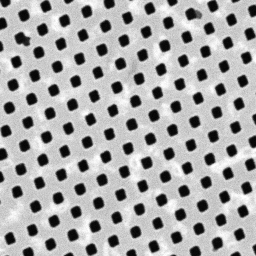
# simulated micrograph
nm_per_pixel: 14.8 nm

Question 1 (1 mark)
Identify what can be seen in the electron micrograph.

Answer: a regular array of holes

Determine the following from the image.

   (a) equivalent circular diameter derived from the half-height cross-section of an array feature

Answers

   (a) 180 nm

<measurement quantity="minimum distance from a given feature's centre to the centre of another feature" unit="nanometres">344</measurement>